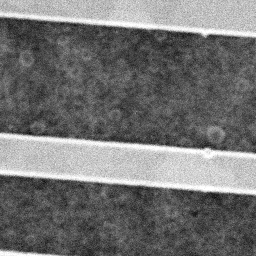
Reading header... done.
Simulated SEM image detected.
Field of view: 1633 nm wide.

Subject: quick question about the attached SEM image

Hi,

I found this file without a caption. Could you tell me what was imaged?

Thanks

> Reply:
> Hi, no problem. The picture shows one or a few lines or trenches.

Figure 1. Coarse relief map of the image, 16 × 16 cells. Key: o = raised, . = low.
oooooooooooooooo
.......ooooooooo
................
................
................
................
................
................
o...............
oooooooooooooo..
oooooooooooooooo
.........ooooooo
................
................
................
................